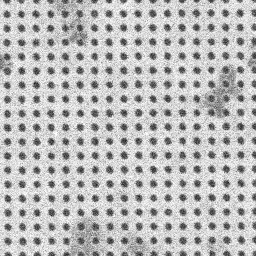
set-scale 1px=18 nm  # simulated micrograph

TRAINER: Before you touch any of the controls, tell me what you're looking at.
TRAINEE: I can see a regular array of holes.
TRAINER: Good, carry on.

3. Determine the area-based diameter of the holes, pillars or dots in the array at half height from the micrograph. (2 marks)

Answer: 7.9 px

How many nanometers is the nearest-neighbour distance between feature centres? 252